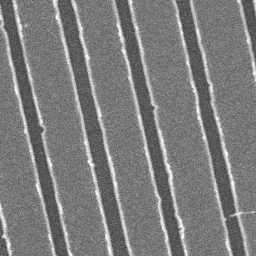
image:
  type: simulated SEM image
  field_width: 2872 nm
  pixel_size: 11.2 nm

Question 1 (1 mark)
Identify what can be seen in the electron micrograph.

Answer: parallel lines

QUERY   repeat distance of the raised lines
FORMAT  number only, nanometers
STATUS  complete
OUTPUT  649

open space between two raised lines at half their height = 172 nm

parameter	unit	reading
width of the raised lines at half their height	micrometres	0.469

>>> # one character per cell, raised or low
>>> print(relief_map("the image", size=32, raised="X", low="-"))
--XXXXX--XXXXX--XXXXXX--XXXXXX--
--XXXXX--XXXXXX--XXXXX--XXXXXX--
--XXXXX---XXXXX--XXXXX--XXXXXXX-
--XXXXXX--XXXXX--XXXXXX--XXXXXX-
X--XXXXX--XXXXX--XXXXXX--XXXXXX-
X--XXXXX--XXXXX--XXXXXX--XXXXXX-
X--XXXXX---XXXXX--XXXXX--XXXXXX-
X--XXXXXX--XXXXX--XXXXXX--XXXXXX
XX-XXXXXX--XXXXX--XXXXXX--XXXXXX
XX--XXXXX--XXXXX--XXXXXX--XXXXXX
XX--XXXXX--XXXXXX-XXXXXX--XXXXXX
XX--XXXXX---XXXXX--XXXXXX-XXXXXX
XX--XXXXXX--XXXXX--XXXXXX-XXXXXX
XXX--XXXXX--XXXXX--XXXXXX--XXXXX
XXX--XXXXX--XXXXX--XXXXXX--XXXXX
XXX--XXXXX---XXXXX--XXXXX--XXXXX
XXX--XXXXXX--XXXXX--XXXXX---XXXX
XXXX-XXXXXX--XXXXX--XXXXXX--XXXX
XXXX--XXXXX--XXXXX--XXXXXX--XXXX
XXXX--XXXXX--XXXXXX--XXXXX--XXXX
XXXX--XXXXXX--XXXXX--XXXXX--XXXX
XXXXX-XXXXXX--XXXXX--XXXXXX--XXX
XXXXX--XXXXX--XXXXX--XXXXXX--XXX
XXXXX--XXXXX--XXXXX--XXXXXX--XXX
XXXXX--XXXXX---XXXXX--XXXXX--XXX
XXXXX--XXXXXX--XXXXX--XXXXX--XXX
XXXXXX--XXXXX--XXXXX--XXXXXX--XX
XXXXXX--XXXXX--XXXXX--XXXXXX--XX
-XXXXX--XXXXX--XXXXXX--XXXXX--XX
-XXXXX--XXXXXX--XXXXX--XXXXX--XX
-XXXXXX-XXXXXX--XXXXX--XXXXXX--X
-XXXXXX--XXXXX--XXXXX--XXXXXX--X